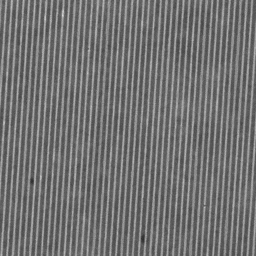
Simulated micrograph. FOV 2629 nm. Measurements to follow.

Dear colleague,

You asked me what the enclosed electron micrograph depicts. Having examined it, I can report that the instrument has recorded parallel lines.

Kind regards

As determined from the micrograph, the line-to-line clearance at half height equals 4.49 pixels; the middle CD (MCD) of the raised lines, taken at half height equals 14.1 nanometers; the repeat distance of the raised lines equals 58.7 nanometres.